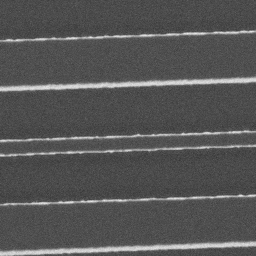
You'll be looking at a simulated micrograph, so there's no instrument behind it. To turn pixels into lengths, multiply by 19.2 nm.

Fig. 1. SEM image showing lines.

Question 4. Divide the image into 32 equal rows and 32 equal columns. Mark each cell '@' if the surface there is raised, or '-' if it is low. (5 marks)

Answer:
--------------------------------
--------------------------------
--------------------------------
--------------------------------
-----------------@@@@@@@@@@@@@@@
@@@@@@@@@@@@@@@@@@@@@@@@@@@@@@@@
@@@@@@@@@@@@@@@@@@@@@@@@@@@@@@@@
@@@@@@@@@@@@@@@@@@@@@@@@@@@@@@@@
@@@@@@@@@@@@@@@@@@@@@@@@@@@@@@@@
@@@@@@@@@@@@@@@@@@@@@@@@@@@@@@@@
@@@@@@@@@@@@@@@@@@--------------
--------------------------------
--------------------------------
--------------------------------
--------------------------------
--------------------------------
----------------------------@@@@
---@@@@@@@@@@@@@@@@@@@@@@@@@@@@@
@@@@@@@@@@@@@@@@@@@@@@@@@@------
--------------------------------
--------------------------------
--------------------------------
--------------------------------
--------------------------------
------------------------------@@
@@@@@@@@@@@@@@@@@@@@@@@@@@@@@@@@
@@@@@@@@@@@@@@@@@@@@@@@@@@@@@@@@
@@@@@@@@@@@@@@@@@@@@@@@@@@@@@@@@
@@@@@@@@@@@@@@@@@@@@@@@@@@@@@@@@
@@@@@@@@@@@@@@@@@@@@@@@@@@@@@@@@
@@@@@@@@@@@@@@@@@@@@@@@@@@@@@@@-
@@@@@@@-------------------------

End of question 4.